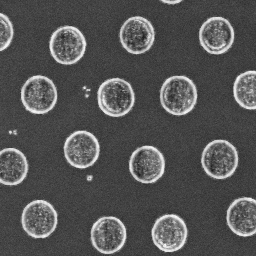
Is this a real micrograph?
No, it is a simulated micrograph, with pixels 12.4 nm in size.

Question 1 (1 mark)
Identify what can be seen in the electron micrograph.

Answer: a regular array of raised bodies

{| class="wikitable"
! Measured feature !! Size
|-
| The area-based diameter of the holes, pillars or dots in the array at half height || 423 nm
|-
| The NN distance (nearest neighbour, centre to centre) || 774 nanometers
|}